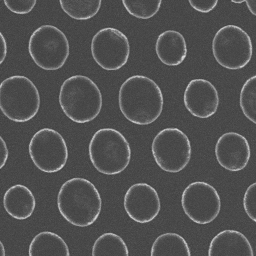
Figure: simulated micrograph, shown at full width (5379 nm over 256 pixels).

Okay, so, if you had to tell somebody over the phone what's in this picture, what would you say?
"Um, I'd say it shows a regular array of raised bodies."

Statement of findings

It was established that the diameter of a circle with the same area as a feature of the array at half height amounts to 836 nanometers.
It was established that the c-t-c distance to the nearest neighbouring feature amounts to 1230 nm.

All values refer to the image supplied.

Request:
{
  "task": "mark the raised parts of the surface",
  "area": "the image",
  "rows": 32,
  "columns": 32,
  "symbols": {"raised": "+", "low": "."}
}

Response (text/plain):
.+++....++++....++++....+++....+
..+.....++++....+++.............
................................
.....++.....................++..
....++++....++++....+++....++++.
+...++++....++++....+++....++++.
+...++++....++++....+++....++++.
....++++....++++....+++....++++.
.....++......++..............+..
................................
++++....++++...++++.....++.....+
+++++...++++...+++++...++++...++
+++++...+++++..+++++...++++...++
+++++...+++++..+++++...++++...++
.+++.....+++....++++.....+.....+
................................
.....++.....+++.....+++.........
....++++....++++...++++....++++.
+...++++...+++++...+++++...++++.
+...++++...+++++...+++++...++++.
....++++....++++....+++.....+++.
.............++.................
.........++.....................
.++.....++++....+++....++++....+
.+++...+++++....++++...++++....+
.+++...++++++...++++...++++....+
.+++....++++....++++...++++....+
........++++.....++.....++......
................................
.....++......++.....++.....+++..
....++++....++++...++++...+++++.
....++++....++++...+++++..+++++.